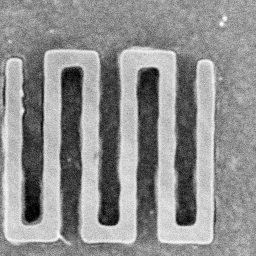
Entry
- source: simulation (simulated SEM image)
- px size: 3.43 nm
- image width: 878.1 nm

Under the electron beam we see groups of lines, slits or small figures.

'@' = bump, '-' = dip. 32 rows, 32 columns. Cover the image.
--------------------------------
--------------------------------
--------------------------------
--------------------------------
--------------------------------
--------------------------------
------@@@@@@---@@@@@@-----------
-@----@@@@@@---@@@@@@@----------
-@@---@@--@@---@@@-@@@---@@-----
-@@---@@--@@---@@---@@---@@-----
-@@---@@--@@---@@---@@---@@-----
-@@---@@--@@---@@---@@---@@-----
-@@---@@--@@---@@---@@---@@-----
-@@---@@--@@---@@---@@---@@-----
-@@---@@--@@---@@---@@---@@-----
-@@---@@--@@---@@---@@---@@-----
-@@---@@--@@---@@---@@---@@-----
-@@---@@--@@---@@---@@---@@-----
-@@---@@--@@---@@---@@---@@-----
-@@---@---@@---@@---@@---@@-----
-@@---@@--@@---@@---@@---@@-----
-@@--@@@--@@---@@---@@---@@-----
-@@--@@---@@---@@---@@---@@-----
-@@---@---@@---@@---@@---@@-----
-@@---@---@@---@@---@@---@@-----
-@@--@@---@@---@@---@@---@@-----
-@@--@@---@@---@@---@@---@@-----
-@@--@@---@@---@@---@@--@@@-----
-@@@@@@---@@@@@@@---@@@@@@@-----
-@@@@@@---@@@@@@@---@@@@@@@-----
--------------------------------
--------------------------------